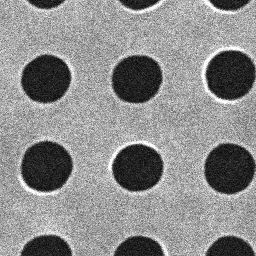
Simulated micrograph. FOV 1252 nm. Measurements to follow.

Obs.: holes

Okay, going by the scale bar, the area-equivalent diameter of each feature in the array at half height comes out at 244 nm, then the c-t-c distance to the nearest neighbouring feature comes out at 88.1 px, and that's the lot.